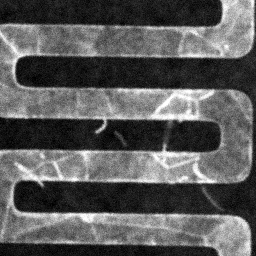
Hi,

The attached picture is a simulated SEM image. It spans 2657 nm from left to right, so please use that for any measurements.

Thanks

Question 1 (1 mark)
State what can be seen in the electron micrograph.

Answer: groups of lines, slits or small figures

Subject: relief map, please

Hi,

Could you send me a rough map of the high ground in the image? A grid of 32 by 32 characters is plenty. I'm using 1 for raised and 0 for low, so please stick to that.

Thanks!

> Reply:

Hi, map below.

00000000000000000000000000001111
00000000000000000000000000001111
00000000000000000000000000001111
11111111111111111110111111111111
11111111111111111111111111111111
11111111111111111111111111111110
11111111111111111111111111111110
11000000000000000000000000000000
11000000000000000000000000000000
11000000000000000000000000000000
11000000000000000000000000000000
11111111111111111111111111111100
11111111111111111111100011111110
11111111111111111111000001111110
11111111111111111110000001111110
00000000000000000000000000011110
00000000000000000000000000001110
00000000000000000000000000001110
00000000000000000000000000011110
11111111111111111111000001111110
11111111111111111111001111111110
11111111111111111111111111111110
11001111111111111111111111111100
11000000000000000000000000000000
11000000000000000000000000000000
11000000000000000000000000000000
11000000000000000000000000000000
11111111111111111111111111111100
11111111111111111111111111111110
11111111111111111111111111111110
00000000000000000111111111111110
00000000000000000000000000011110